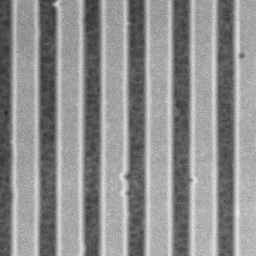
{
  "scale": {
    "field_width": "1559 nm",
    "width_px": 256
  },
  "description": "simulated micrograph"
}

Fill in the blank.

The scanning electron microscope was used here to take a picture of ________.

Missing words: parallel lines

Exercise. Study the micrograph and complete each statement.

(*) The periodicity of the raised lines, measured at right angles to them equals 271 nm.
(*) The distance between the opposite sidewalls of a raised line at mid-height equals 153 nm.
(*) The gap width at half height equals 0.117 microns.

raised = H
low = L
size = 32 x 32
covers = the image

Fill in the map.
LLHHHLLHHHLLLHHHLLHHHLLLHHHLLHHH
LLHHHLLHHHLLLHHHLLHHHLLLHHHLLHHH
LLHHHLLHHHLLLHHHLLHHHLLLHHHLLHHH
LLHHHLLHHHLLLHHHLLHHHLLLHHHLLHHH
LLHHHLLHHHLLLHHHLLHHHLLLHHHLLHHH
LLHHHLLHHHLLLHHHLLHHHLLLHHHLLHHH
LLHHHLLHHHLLLHHHLLHHHLLLHHHLLHHH
LLHHHLLHHHLLLHHHLLHHHLLLHHHLLHHH
LLHHHLLHHHLLLHHHLLHHHLLLHHHLLHHH
LLHHHLLHHHLLLHHHLLHHHLLLHHHLLLHH
LLHHHLLHHHLLLHHHLLHHHLLLHHHLLLHH
LLHHHLLHHHLLLHHHLLHHHLLLHHHLLLHH
LLHHHLLHHHLLLHHHLLHHHLLLHHHLLLHH
LLHHHLLHHHLLLHHHLLHHHLLLHHHLLLHH
LLHHHLLHHHLLLHHHLLHHHLLLHHHLLLHH
LLHHHLLHHHLLLHHHLLHHHLLLHHHLLHHH
LLHHHLLHHHLLLHHHLLHHHLLLHHHLLHHH
LLHHHLLHHHLLLHHHLLHHHLLLHHHLLHHH
LLHHHLLHHHLLLHHHLLHHHLLLHHHLLHHH
LLHHHLLHHHLLLHHHLLHHHLLLHHHLLHHH
LLHHHLLHHHLLLHHHLLHHHLLLHHHLLLHH
LLHHHLLHHHLLLHHHLLHHHLLLHHHLLHHH
LLHHHLLHHHLLLHHHLLHHHLLLHHHLLHHH
LLHHHLLHHHLLLHHHLLHHHLLLHHHLLHHH
LLHHHLLHHHLLLHHHLLHHHLLLHHHLLHHH
LLHHHLLHHHLLLHHHLLHHHLLLHHHLLHHH
LLHHHLLHHHLLLHHHLLHHHLLLHHHLLHHH
LLHHHLLHHHLLLHHHLLHHHLLLHHHLLHHH
LLHHHLLHHHLLLHHHLLHHHLLLHHHLLHHH
LLHHHLLHHHLLLHHHLLHHHLLLHHHLLHHH
LLHHHLLHHHLLLHHHLLHHHLLLHHHLLHHH
LLHHHLLHHHLLLHHHLLHHHLLLHHHLLHHH